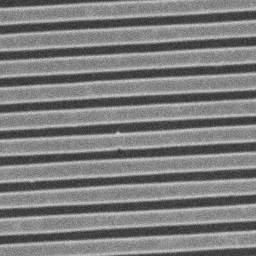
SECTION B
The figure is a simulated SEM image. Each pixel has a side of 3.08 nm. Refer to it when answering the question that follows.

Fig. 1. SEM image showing parallel lines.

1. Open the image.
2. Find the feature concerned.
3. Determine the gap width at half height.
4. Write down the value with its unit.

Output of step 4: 33.5 nanometres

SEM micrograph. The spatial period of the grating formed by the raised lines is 0.0809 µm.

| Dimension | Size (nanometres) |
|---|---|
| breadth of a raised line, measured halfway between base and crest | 47.7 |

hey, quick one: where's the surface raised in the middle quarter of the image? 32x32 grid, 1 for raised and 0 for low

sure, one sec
11111111111111111111111111111100
11111111111100000000000000000000
00000000000000000000000000000000
00000000000000000000000000000111
00000000100111111111111111111111
11111111111111111111111111111111
11111111111111111111111111111111
11111111111111111111111000000000
11111000000000000000000000000000
00000000000000000000000000000000
00000000000000000000001111111111
00001111111111111111111111111111
11111111111111111111111111111111
11111111111111111111111111111111
11111111111111110000000000000000
00000000000000000000000000000000
00000000000000000000000000000000
00000000000001011111111111111111
11111111111111111111111111111111
11111111111111111111111111111111
11111111111111111111111111000000
11111111100000000000000000000000
00000000000000000000000000000000
00000000000000000000000001111111
00001111111111111111111111111111
11111111111111111111111111111111
11111111111111111111111111111111
11111111111111111110000000000000
11000000000000000000000000000000
00000000000000000000000000000000
00000000000000111111111111111111
11111111111111111111111111111111